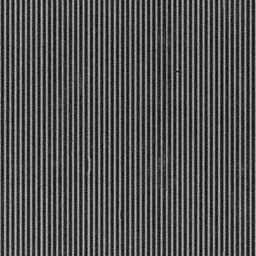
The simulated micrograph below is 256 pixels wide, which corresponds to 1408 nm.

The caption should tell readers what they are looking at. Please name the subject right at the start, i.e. parallel lines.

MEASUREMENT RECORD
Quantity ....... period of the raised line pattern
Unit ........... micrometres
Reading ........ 0.0288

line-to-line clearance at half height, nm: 19.2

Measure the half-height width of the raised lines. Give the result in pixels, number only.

1.75